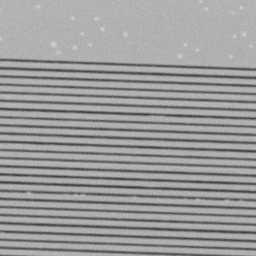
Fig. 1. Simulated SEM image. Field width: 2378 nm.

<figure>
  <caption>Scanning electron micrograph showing parallel lines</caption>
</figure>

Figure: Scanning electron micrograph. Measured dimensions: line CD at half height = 5.62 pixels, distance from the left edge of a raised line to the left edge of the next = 0.0758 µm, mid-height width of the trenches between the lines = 17.4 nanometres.